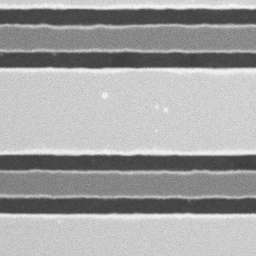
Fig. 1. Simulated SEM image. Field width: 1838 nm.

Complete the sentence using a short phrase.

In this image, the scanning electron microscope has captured lines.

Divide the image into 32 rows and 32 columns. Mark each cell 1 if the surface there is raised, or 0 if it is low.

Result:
11111111111111111111111111111111
00000000000000000000000000000000
00000000000000000000000000000000
11111111111111111111111111111111
11111111111111111111111111111111
11111111111111111111111111111111
00000000000000000000111110001000
00000000000000000000000000000000
00000000000000000000000000000000
11111111111111111111111111111111
11111111111111111111111111111111
11111111111111111111111111111111
11111111111111111111111111111111
11111111111111111111111111111111
11111111111111111111111111111111
11111111111111111111111111111111
11111111111111111111111111111111
11111111111111111111111111111111
11111111111111111111111111111111
00000000000000000000000000000000
00000000000000000000000000000000
11111111111111111111111111111111
11111111111111111111111111111111
11111111111111111111111111111111
11111111111111111111111111111111
00000000000000000000000000000000
00000000000000000000000000000000
11111111111111111111111111111111
11111111111111111111111111111111
11111111111111111111111111111111
11111111111111111111111111111111
11111111111111111111111111111111